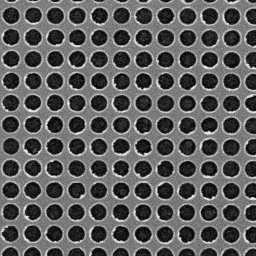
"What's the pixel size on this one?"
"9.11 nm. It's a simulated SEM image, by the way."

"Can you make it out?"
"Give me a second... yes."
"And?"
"a regular array of holes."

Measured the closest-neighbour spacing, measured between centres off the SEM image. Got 0.197 µm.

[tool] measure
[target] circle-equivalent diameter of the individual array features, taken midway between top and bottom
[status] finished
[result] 151 nanometres